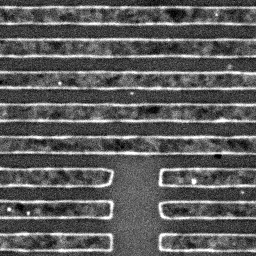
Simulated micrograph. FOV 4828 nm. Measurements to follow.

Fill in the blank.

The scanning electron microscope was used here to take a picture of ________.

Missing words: wiring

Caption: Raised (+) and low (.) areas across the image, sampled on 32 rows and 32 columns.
................................
++++++++++++++++++++++++++++++++
++++++++++++++++++++++++++++++++
................................
................................
++++++++++++++++++++++++++++++++
++++++++++++++++++++++++++++++++
................................
................................
++++++++++++++++++++++++++++++++
++++++++++++++++++++++++++++++++
................................
................................
++++++++++++++++++++++++++++++++
++++++++++++++++++++++++++++++++
................................
................................
++++++++++++++++++++++++++++++++
++++++++++++++++++++++++++++++++
................................
................................
++++++++++++++......++++++++++++
++++++++++++++......++++++++++++
................................
................................
++++++++++++++......++++++++++++
++++++++++++++......++++++++++++
................................
................................
++++++++++++++......++++++++++++
++++++++++++++......++++++++++++
................................